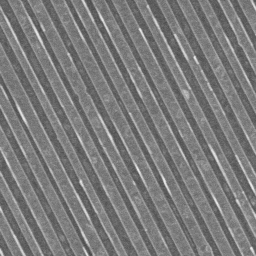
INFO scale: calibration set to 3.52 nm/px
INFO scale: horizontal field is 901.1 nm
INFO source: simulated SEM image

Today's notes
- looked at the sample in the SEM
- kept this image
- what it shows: parallel lines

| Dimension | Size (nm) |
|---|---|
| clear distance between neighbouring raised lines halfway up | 26.3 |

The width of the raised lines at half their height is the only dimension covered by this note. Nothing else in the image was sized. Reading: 11.1 pixels